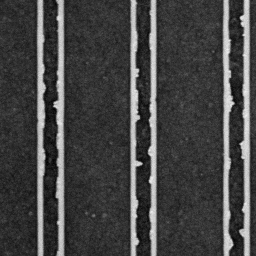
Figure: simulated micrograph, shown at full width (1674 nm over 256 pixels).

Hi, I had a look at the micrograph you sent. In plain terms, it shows one or a few lines or trenches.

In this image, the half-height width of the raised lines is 132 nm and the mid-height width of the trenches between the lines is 0.477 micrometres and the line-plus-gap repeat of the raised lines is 0.607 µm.